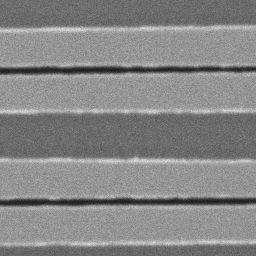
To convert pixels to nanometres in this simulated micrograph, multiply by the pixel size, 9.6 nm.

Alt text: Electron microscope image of lines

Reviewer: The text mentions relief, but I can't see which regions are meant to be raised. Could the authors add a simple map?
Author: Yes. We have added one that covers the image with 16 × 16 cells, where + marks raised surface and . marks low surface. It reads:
................
................
++++++++++++++++
++++++++++++++++
++.+++++++++++++
++++++++++++++++
++++++++++++++++
................
................
................
++++++++++++++++
++++++++++++++++
++++++++++++++++
++++++++++++++++
++++++++++++++++
................